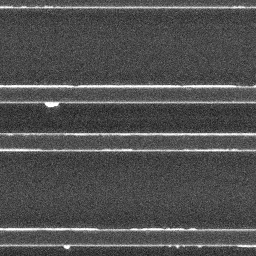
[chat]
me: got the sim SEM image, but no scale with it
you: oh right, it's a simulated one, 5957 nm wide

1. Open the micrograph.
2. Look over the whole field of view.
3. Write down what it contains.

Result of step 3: lines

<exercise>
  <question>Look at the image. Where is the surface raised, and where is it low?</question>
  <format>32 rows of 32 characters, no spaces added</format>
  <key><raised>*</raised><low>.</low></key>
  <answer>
********************************
................................
................................
................................
................................
................................
................................
................................
................................
................................
................................
********************************
********************************
................................
................................
................................
................................
********************************
********************************
................................
................................
................................
................................
................................
................................
................................
................................
................................
................................
********************************
********************************
................................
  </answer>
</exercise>